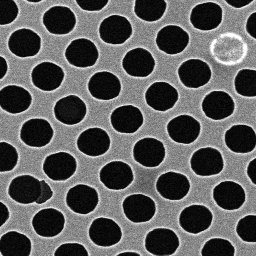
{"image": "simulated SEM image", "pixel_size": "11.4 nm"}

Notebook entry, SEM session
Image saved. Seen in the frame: a regular array of holes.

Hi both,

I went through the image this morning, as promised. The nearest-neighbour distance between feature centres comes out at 455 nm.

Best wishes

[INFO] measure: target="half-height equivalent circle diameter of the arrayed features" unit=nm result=348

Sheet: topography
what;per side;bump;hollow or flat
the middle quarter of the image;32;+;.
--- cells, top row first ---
+++....++++++++........++++++...
+++++++++++++++.......+++++++...
++++++++....++++.....++++++++...
+++++++......++++++++++++++++...
++++++........++++++++++.++++...
++++++........++++++++.....++++.
++++++........+++++++.......++++
+++++++.......++++++........++++
....++++.....+++++++........++++
.....++++++++++++++++.......++++
.....++++++++++..++++......+++++
......+++++++......++++...++++++
.....+++++++.......+++++++++++++
.....+++++++........++++++++....
....++++++++........++++++......
++++++++++++.......+++++++......
++++++....+++.....++++++++......
++++.......+++++++++++++++......
+++........++++++++++.+++++.....
+++.........++++++......++++....
+++........+++++++.......+++++++
++++.......++++++........+++++++
.++++.....+++++++........+++++++
...+++++++++++++++.......+++++++
...+++++++++..+++++.....++++++++
...+++++++......++++...+++++++++
...++++++........+++++++++++++++
..+++++++........++++++++....+++
.++++++++........+++++++.......+
++++++++++.......++++++........+
+++...++++......+++++++........+
+.......+++++.+++++++++........+